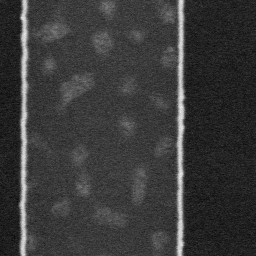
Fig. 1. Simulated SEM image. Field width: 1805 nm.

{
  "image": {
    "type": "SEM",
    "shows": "one or a few lines or trenches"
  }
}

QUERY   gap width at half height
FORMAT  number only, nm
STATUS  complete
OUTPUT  1100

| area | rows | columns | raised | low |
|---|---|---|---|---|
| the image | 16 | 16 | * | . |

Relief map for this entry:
**.........*****
*..........*****
*..........*****
**.........*****
*..........*****
**.........*****
*..........*****
*..........*****
*..........*****
*..........*****
*..........*****
*..........*****
*..........*****
*..........*****
*..........*****
*..........*****